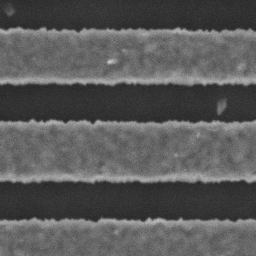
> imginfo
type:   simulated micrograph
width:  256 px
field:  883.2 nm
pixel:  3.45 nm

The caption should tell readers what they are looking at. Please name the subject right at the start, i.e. lines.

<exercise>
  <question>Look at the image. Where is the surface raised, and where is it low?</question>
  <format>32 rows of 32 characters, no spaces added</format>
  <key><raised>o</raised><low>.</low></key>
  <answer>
................................
................................
................................
................................
oooooooooooooooooooooooooooooooo
oooooooooooooooooooooooooooooooo
oooooooooooooooooooooooooooooooo
oooooooooooooooooooooooooooooooo
oooooooooooooooooooooooooooooooo
oooooooooooooooooooooooooooooooo
ooo....oo.o.ooo...o....o...o..o.
................................
................................
................................
................................
oooooooooooooooooooooooooooooooo
oooooooooooooooooooooooooooooooo
oooooooooooooooooooooooooooooooo
oooooooooooooooooooooooooooooooo
oooooooooooooooooooooooooooooooo
oooooooooooooooooooooooooooooooo
oooooooooooooooooooooooooooooooo
oooooo.ooooooooooooooo.ooooooooo
................................
................................
................................
................................
...oo.o.ooo..ooo..ooo.o.o.o...oo
oooooooooooooooooooooooooooooooo
oooooooooooooooooooooooooooooooo
oooooooooooooooooooooooooooooooo
oooooooooooooooooooooooooooooooo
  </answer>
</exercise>